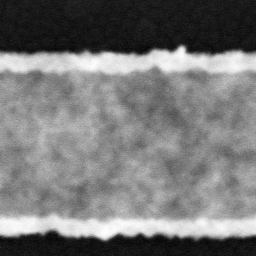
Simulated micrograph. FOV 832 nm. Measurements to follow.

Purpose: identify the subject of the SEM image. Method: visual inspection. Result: one or a few lines or trenches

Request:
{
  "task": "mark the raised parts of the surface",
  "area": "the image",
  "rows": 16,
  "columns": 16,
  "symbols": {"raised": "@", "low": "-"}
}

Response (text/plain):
----------------
----------------
----------------
----------------
@@@@@@@@@@@@@@@@
@@@@@@@@@@@@@@@@
@@@@@@@@@@@@@@@@
@@@@@@@@@@@@@@@@
@@@@@@@@@@@@@@@@
@@@@@@@@@@@@@@@@
@@@@@@@@@@@@@@@@
@@@@@@@@@@@@@@@@
@@@@@@@@@@@@@@@@
@@@@@@@@@@@@@@@@
----------------
----------------